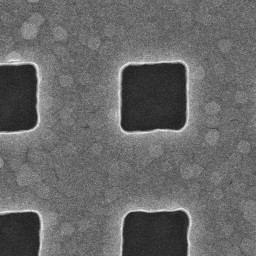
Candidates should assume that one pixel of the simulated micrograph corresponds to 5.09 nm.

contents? holes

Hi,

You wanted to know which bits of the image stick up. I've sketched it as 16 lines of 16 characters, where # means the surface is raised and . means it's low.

################
################
################
################
..######....####
..######....####
..######....####
..######....####
################
################
################
################
################
..######....####
...#####....####
..######....####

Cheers